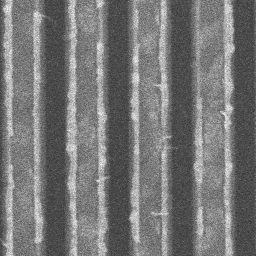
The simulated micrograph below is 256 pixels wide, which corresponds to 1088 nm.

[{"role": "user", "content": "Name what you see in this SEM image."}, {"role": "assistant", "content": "one or a few lines or trenches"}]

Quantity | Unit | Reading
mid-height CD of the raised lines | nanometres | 152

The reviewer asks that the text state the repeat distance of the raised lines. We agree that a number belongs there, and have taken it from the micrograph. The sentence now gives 270 nanometers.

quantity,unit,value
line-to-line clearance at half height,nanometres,117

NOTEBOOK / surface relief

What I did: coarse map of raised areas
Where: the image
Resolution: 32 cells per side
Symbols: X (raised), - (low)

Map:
-XXXX----XXXX----XXXX---XXXXX---
-XXXX----XXXX----XXXX---XXXXX---
-XXXX----XXXX----XXXX---XXXXX---
-XXXX----XXXX----XXXX---XXXXX---
-XXXX----XXXX----XXXX---XXXXX---
XXXXX----XXXX----XXXX---XXXXX---
-XXXX----XXXX----XXXX---XXXXX---
-XXXX----XXXX----XXXX---XXXXX---
-XXXX----XXXX----XXXX---XXXXX---
-XXXX----XXXX----XXXX---XXXXX---
-XXXX----XXXX----XXXX---XXXXX---
-XXXX----XXXX----XXXX---XXXXX---
-XXXX----XXXX---XXXXX---XXXXX---
-XXXX----XXXX---XXXXX---XXXXX---
-XXXX---XXXXX---XXXXX---XXXXX---
-XXXX---XXXXX----XXXX----XXXX---
-XXXX---XXXXX----XXXX---XXXXX---
-XXXX---XXXXX----XXXX---XXXXX---
-XXXX---XXXXX----XXXX----XXXX---
-XXXX----XXXX----XXXX----XXXX---
-XXXX----XXXX----XXXX---XXXXX---
-XXXX----XXXX----XXXX---XXXXX---
-XXXX---XXXXX----XXXX----XXXX---
-XXXX---XXXXX----XXXX----XXXX---
-XXXX----XXXX---XXXXX----XXXX---
-XXXX----XXXX---XXXXX----XXXX---
-XXXX----XXXX---XXXXX----XXXX---
-XXXX----XXXX---XXXXX----XXXX---
-XXXX----XXXX----XXXX----XXXX---
-XXXX----XXXX----XXXX----XXXX---
-XXXX----XXXX----XXXX----XXXX---
-XXXX----XXXX----XXXX----XXXX---